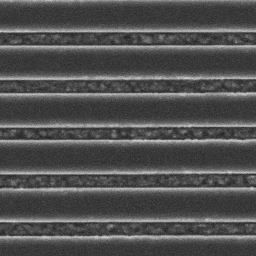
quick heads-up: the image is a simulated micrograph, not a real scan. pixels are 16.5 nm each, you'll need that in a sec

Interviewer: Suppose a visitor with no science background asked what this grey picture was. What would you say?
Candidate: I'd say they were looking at lines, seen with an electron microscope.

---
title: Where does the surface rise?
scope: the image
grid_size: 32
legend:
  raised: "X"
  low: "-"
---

XXXXXXXXXXXXXXXXXXXXXXXXXXXXXXXX
XXXXXXXXXXXXXXXXXXXXXXXXXXXXXXXX
XXXXXXXXXXXXXXXXXXXXXXXXXXXXXXXX
XXXXXXXXXXXXXXXXXXXXXXXXXXXXXXXX
--------------------------------
--------------------------------
XXXXXXXXXXXXXXXXXXXXXXXXXXXXXXXX
XXXXXXXXXXXXXXXXXXXXXXXXXXXXXXXX
XXXXXXXXXXXXXXXXXXXXXXXXXXXXXXXX
XXXXXXXXXXXXXXXXXXXXXXXXXXXXXXXX
--------------------------------
--------------------------------
XXXXXXXXXXXXXXXXXXXXXXXXXXXXXXXX
XXXXXXXXXXXXXXXXXXXXXXXXXXXXXXXX
XXXXXXXXXXXXXXXXXXXXXXXXXXXXXXXX
XXXXXXXXXXXXXXXXXXXXXXXXXXXXXXXX
--------------------------------
--------------------------------
XXXXXXXXXXXXXXXXXXXXXXXXXXXXXXXX
XXXXXXXXXXXXXXXXXXXXXXXXXXXXXXXX
XXXXXXXXXXXXXXXXXXXXXXXXXXXXXXXX
XXXXXXXXXXXXXXXXXXXXXXXXXXXXXXXX
--------------------------------
--------------------------------
XXXXXXXXXXXXXXXXXXXXXXXXXXXXXXXX
XXXXXXXXXXXXXXXXXXXXXXXXXXXXXXXX
XXXXXXXXXXXXXXXXXXXXXXXXXXXXXXXX
XXXXXXXXXXXXXXXXXXXXXXXXXXXXXXXX
--------------------------------
--------------------------------
XXXXXXXXXXXXXXXXXXXXXXXXXXXXXXXX
XXXXXXXXXXXXXXXXXXXXXXXXXXXXXXXX